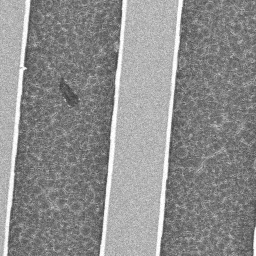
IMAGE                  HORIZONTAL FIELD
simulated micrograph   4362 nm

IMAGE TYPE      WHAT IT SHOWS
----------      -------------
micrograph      one or a few lines or trenches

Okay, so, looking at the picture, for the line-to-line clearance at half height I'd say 97.2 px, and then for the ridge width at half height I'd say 940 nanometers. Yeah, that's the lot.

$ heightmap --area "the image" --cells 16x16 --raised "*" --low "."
**......***.....
**......***.....
**......***.....
*.......***.....
*......****.....
*......****.....
*......****.....
*......****.....
*......****.....
*......***......
*......***......
*......***......
*......***......
*......***......
.......***......
......****......